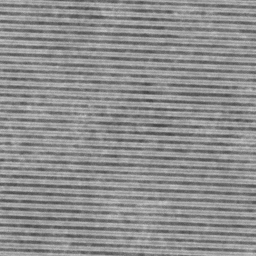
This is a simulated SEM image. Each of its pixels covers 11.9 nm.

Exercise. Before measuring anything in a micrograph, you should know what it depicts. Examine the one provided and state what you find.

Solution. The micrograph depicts parallel lines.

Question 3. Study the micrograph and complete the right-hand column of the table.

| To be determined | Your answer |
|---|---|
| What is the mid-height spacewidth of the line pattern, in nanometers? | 62.7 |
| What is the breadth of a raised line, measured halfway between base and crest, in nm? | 32.8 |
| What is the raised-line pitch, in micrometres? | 0.0972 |